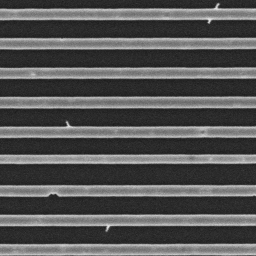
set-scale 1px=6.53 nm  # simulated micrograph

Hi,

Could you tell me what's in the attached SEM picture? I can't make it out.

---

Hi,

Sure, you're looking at parallel lines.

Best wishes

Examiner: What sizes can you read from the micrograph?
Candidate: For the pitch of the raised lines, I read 29.4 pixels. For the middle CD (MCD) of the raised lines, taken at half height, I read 71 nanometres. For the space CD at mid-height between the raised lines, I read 0.122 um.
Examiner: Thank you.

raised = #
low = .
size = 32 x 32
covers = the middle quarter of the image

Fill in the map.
................................
################################
################################
....#...#..............#........
................................
................................
................................
................................
################################
################################
################################
................................
................................
................................
................................
##..............................
################################
################################
................................
................................
................................
................................
................................
################################
################################
................................
................................
................................
................................
................................
################################
################################